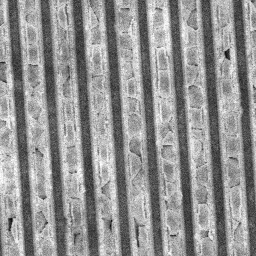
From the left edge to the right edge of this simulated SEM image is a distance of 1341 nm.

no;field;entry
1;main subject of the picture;parallel lines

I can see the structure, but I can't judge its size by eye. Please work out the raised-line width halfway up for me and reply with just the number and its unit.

107 nm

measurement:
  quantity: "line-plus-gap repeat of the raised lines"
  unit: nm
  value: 168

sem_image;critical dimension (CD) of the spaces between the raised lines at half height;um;0.0627